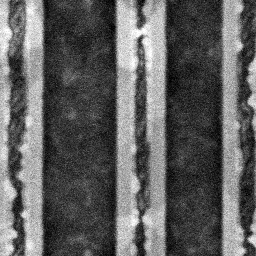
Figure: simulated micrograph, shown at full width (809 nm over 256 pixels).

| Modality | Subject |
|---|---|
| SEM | one or a few lines or trenches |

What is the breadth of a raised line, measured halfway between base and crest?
104 nm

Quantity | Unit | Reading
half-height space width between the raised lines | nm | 252